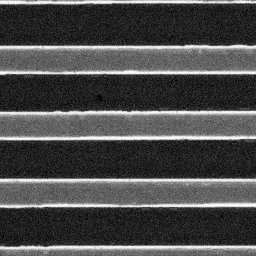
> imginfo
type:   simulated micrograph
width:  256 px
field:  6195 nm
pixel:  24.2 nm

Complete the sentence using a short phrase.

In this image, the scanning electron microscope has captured lines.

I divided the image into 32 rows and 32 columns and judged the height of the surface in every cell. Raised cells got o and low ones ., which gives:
................................
................................
................................
................................
................................
................................
oooooooooooooooooooooooooooooooo
oooooooooooooooooooooooooooooooo
oooooooooooooooooooooooooooooooo
................................
................................
................................
................................
................................
oooooooooooooooooooooooooooooooo
oooooooooooooooooooooooooooooooo
oooooooooooooooooooooooooooooooo
................................
................................
................................
................................
................................
oooooooooooooooooooooooooooooooo
oooooooooooooooooooooooooooooooo
oooooooooooooooooooooooooooooooo
oooooooooooooooooooooooooooooooo
................................
................................
................................
................................
................................
oooooooooooooooooooooooooooooooo